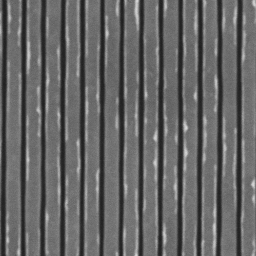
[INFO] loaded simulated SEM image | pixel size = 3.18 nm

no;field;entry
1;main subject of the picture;parallel lines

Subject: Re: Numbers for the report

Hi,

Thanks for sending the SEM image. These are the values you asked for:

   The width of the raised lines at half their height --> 45.3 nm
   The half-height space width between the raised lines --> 15.9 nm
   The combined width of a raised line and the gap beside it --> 62.2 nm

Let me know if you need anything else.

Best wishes